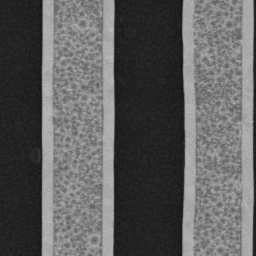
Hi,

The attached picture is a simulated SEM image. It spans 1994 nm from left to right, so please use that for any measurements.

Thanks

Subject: one or a few lines or trenches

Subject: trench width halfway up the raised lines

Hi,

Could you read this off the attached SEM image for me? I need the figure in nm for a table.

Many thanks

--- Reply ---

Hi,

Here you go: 620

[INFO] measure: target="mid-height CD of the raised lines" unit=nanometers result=476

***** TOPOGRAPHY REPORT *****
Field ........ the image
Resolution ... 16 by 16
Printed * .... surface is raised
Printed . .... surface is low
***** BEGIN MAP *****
...****.....****
...****.....****
...****.....****
...****.....****
...****.....****
...****.....****
...****.....****
...****.....****
...****.....***.
...****.....***.
...****.....***.
...****.....***.
...****.....***.
...****.....***.
...****.....***.
...****.....***.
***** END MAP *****